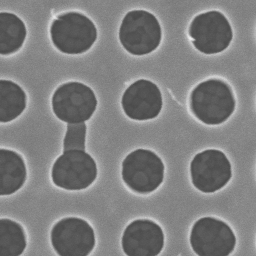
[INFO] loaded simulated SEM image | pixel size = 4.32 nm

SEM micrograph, holes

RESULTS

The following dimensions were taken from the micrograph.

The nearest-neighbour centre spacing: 0.292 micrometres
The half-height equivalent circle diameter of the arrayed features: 186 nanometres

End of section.